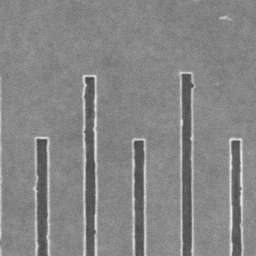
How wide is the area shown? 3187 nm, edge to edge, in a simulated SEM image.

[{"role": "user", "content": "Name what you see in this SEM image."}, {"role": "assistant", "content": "parallel lines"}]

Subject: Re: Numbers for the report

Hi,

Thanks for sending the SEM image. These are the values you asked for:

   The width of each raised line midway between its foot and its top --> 467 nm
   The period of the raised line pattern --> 0.602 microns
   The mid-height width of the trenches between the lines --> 134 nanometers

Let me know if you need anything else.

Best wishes